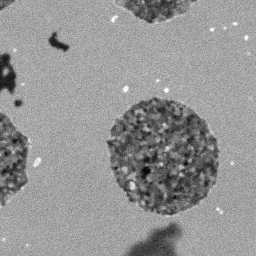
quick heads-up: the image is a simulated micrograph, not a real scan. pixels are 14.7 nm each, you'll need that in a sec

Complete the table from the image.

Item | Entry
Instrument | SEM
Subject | raised bodies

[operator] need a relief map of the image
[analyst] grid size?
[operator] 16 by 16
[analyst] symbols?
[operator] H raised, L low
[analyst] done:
LLLLLLLLHHHHLLLL
LLLLLLLLLLLLLLLL
LLLLLLLLLLLLLLLL
LLLLLLLLLLLLLLLL
LLLLLLLLLLLLLLLL
LLLLLLLLLLLLLLLL
LLLLLLLLHHHLLLLL
HLLLLLLHHHHHHLLL
HHLLLLLHHHHHHLLL
HHLLLLLHHHHHHHLL
HHLLLLLHHHHHHHLL
HHLLLLLHHHHHHLLL
HLLLLLLLHHHHHLLL
LLLLLLLLLLLLLLLL
LLLLLLLLLLLLLLLL
LLLLLLLLLLLLLLLL